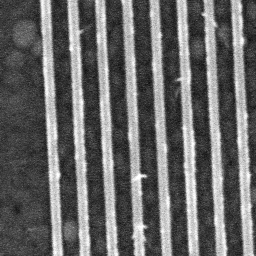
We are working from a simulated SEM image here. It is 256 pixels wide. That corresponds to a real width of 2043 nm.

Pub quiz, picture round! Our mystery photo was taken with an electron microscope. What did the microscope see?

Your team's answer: parallel lines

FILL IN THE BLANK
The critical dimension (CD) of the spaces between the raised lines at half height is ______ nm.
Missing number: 146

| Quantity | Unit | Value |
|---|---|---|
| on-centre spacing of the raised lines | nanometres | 217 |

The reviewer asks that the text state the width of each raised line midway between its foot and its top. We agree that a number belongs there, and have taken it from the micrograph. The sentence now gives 66.8 nanometres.